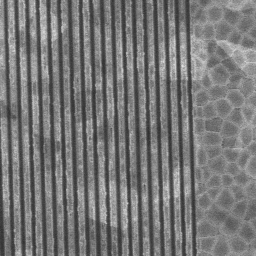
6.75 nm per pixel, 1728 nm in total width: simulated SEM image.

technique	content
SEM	parallel lines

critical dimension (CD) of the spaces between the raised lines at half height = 29.5 nm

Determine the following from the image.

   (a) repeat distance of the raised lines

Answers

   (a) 0.0721 um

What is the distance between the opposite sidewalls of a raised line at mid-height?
46.4 nm